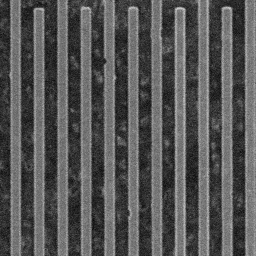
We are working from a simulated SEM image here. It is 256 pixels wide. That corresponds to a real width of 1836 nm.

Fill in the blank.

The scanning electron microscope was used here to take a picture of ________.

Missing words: parallel lines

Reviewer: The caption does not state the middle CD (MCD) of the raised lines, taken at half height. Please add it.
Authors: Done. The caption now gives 8.88 px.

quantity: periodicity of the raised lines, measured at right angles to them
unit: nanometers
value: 168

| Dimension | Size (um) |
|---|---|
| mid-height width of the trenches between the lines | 0.105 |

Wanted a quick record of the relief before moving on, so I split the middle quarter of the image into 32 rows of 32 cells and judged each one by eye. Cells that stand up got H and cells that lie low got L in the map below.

HLLLHHLLLLHHLLLLHHLLLLHHLLLLHHLL
HLLLHHLLLLHHLLLLHHLLLLHHLLLLHHLL
HLLLHHLLLLHHLLLLHHLLLLHHLLLLHHLL
HLLLHHLLLLHHHLLLHHLLLLHHLLLLHHLL
HLLLHHLLLLHHLLLLHHLLLLHHLLLLHHLL
HLLLHHLLLLHHLLLLHHLLLLHHLLLLHHLL
HLLLHHLLLLHHLLLLHHLLLLHHLLLLHHLL
HLLLHHLLLLHHLLLLHHLLLLHHLLLLHHLL
HLLLHHLLLLHHLLLLHHLLLLHHLLLLHHLL
HLLLHHLLLLHHLLLLHHLLLLHHLLLLHHLL
HLLLHHLLLLHHLLLLHHLLLLHHLLLLHHLL
HLLLHHLLLLHHLLLLHHLLLLHHLLLLHHLL
HLLLHHLLLLHHLLLLHHLLLLHHLLLLHHLL
HLLLHHLLLLHHLLLLHHLLLLHHLLLLHHLL
HLLLHHLLLLHHLLLLHHLLLLHHLLLLHHLL
HLLLHHLLLLHHLLLLHHLLLLHHLLLLHHLL
HLLLHHLLLLHHLLLLHHLLLLHHLLLLHHLL
HLLLHHLLLLHHLLLLHHLLLLHHLLLLHHLL
HLLLHHLLLLHHLLLLHHLLLLHHLLLLHHLL
HLLLHHLLLLHHLLLLHHLLLLHHLLLLHHLL
HLLLHHLLLLHHLLLLHHLLLLHHLLLLHHLL
HLLLHHLLLLHHLLLLHHLLLLHHLLLLHHLL
HLLLHHLLLLHHLLLLHHLLLLHHLLLLHHLL
HLLLHHLLLLHHLLLLHHLLLLHHLLLLHHLL
HLLLHHLLLLHHLLLLHHLLLLHHLLLLHHLL
HLLLHHLLLLHHLLLLHHLLLLHHLLLLHHLL
HLLLHHLLLLHHLLLLHHLLLLHHLLLLHHLL
HLLLHHLLLLHHLLLLHHLLLLHHLLLLHHLL
HLLLHHLLLLHHLLLLHHLLLLHHLLLLHHLL
HLLLHHLLLLHHLLLLHHLLLLHHLLLLHHLL
HLLLHHLLLLHHLLLLHHLLLLHHLLLLHHLL
HLLLHHLLLLHHLLLLHHLLLLHHLLLLHHLL